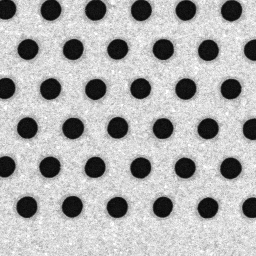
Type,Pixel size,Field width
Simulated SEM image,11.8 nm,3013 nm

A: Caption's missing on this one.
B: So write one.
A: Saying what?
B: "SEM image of a regular array of holes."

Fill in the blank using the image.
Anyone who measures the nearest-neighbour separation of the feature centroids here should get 528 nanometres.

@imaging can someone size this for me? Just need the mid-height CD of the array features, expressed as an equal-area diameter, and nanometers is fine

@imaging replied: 248